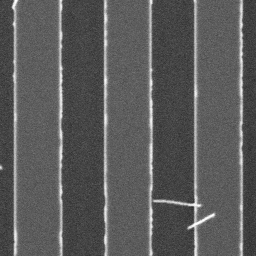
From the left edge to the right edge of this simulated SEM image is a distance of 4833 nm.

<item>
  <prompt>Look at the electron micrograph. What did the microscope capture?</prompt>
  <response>lines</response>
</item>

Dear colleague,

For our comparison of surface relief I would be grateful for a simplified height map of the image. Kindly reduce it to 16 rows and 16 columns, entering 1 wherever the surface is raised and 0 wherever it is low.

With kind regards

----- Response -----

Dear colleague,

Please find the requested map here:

0111000110001110
0111000110001110
0111000110001110
0111000110001110
0111000110001110
0111000110001110
0111000110001110
0111000110001110
0111000110001110
0111000110001110
0111000110001110
0111000110001110
0111000110001110
0111000110001110
0111000110001110
0111000110001110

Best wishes